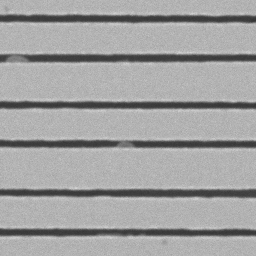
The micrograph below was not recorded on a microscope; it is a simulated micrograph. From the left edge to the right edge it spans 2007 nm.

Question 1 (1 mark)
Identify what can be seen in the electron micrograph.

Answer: lines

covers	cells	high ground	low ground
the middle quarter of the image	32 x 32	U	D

UUUUUUUUUUUUUUUUUUUUUUUUUUUUUUUU
UUUUUUUUUUUUUUUUUUUUUUUUUUUUUUUU
UUUUUUUUUUUUUUUUUUUUUUUUUUUUUUUU
UUUUUUUUUUUUUUUUUUUUUUUUUUUUUUUU
UUUUUUUUUUUUUUUUUUUUUUUUUUUUUUUU
UUUUUUUUUUUUUUUUUUUUUUUUUUUUUUUU
UUUUUUUUUUUUUUUUUUUUUUUUUUUUUUUU
UUUUUUUUUUUUUUUUUUUUUUUUUUUUUUUU
UUUUUUUUUUUUUUUUUUUUUUUUUUUUUUUU
DDDDDDDDDDDDDDDDDDDDDDDDDDDDDDDD
DDDDDDDDDDDDDDDDDDDDDDDDDDDDDDDD
UUUUUUUUUUUUUUUUUUUUUUUUUUUUUUUU
UUUUUUUUUUUUUUUUUUUUUUUUUUUUUUUU
UUUUUUUUUUUUUUUUUUUUUUUUUUUUUUUU
UUUUUUUUUUUUUUUUUUUUUUUUUUUUUUUU
UUUUUUUUUUUUUUUUUUUUUUUUUUUUUUUU
UUUUUUUUUUUUUUUUUUUUUUUUUUUUUUUU
UUUUUUUUUUUUUUUUUUUUUUUUUUUUUUUU
UUUUUUUUUUUUUUUUUUUUUUUUUUUUUUUU
DDDDDDDDDDDDDDDDDDDDDDDDDDDDDDDD
DDDDDDDDDDDDDDDDDDDDDDDDDDDDDDDD
UUUUUUUUUUUUUUUUUUUUUUUUUUUUUUUU
UUUUUUUUUUUUUUUUUUUUUUUUUUUUUUUU
UUUUUUUUUUUUUUUUUUUUUUUUUUUUUUUU
UUUUUUUUUUUUUUUUUUUUUUUUUUUUUUUU
UUUUUUUUUUUUUUUUUUUUUUUUUUUUUUUU
UUUUUUUUUUUUUUUUUUUUUUUUUUUUUUUU
UUUUUUUUUUUUUUUUUUUUUUUUUUUUUUUU
UUUUUUUUUUUUUUUUUUUUUUUUUUUUUUUU
UUUUUUUUUUUUUUUUUUUUUUUUUUUUUUUU
UUUUUUUUUUUUUUUUUUUUUUUUUUUUUUUU
DDDDDDDDDDDDDDDDDDDDDDDDDDDDDDDD